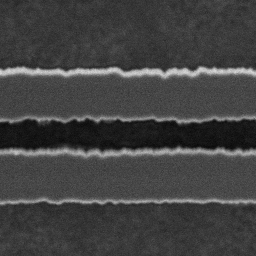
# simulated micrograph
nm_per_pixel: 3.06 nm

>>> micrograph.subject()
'lines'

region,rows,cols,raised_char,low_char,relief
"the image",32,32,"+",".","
................................
................................
................................
................................
................................
................................
................................
................................
................................
++++++++++++++++++++++++++++++++
++++++++++++++++++++++++++++++++
++++++++++++++++++++++++++++++++
++++++++++++++++++++++++++++++++
++++++++++++++++++++++++++++++++
++++++++++++++++++++++++++++++++
................................
................................
................................
................................
++++++++++++++++++++++++++++++++
++++++++++++++++++++++++++++++++
++++++++++++++++++++++++++++++++
++++++++++++++++++++++++++++++++
++++++++++++++++++++++++++++++++
++++++++++++++++++++++++++++++++
................................
................................
................................
................................
................................
................................
................................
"